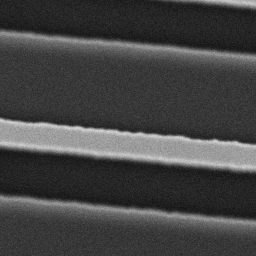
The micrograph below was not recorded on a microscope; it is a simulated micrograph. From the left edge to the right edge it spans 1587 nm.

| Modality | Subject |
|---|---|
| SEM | lines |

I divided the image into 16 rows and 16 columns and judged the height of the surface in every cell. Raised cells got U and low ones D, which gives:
DDDDDDDDDDDDDDDD
DDDDDDDDDDDDDDDD
UUUUDDDDDDDDDDDD
UUUUUUUUUUUUUUUD
UUUUUUUUUUUUUUUU
UUUUUUUUUUUUUUUU
UUUUUUUUUUUUUUUU
UUUUUUUUUUUUUUUU
UUUUUUUUUUUUUUUU
DDDDDUUUUUUUUUUU
DDDDDDDDDDDDDDDU
DDDDDDDDDDDDDDDD
UUDDDDDDDDDDDDDD
UUUUUUUUUUUDDDDD
UUUUUUUUUUUUUUUU
UUUUUUUUUUUUUUUU